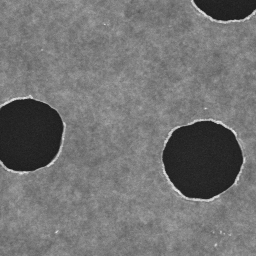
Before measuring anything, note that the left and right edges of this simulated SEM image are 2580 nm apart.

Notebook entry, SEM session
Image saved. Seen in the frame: holes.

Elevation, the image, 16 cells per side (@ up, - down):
@@@@@@@@@@@@----
@@@@@@@@@@@@@@@@
@@@@@@@@@@@@@@@@
@@@@@@@@@@@@@@@@
@@@@@@@@@@@@@@@@
@@@@@@@@@@@@@@@@
---@@@@@@@@@@@@@
----@@@@@@@@@@@@
----@@@@@@@----@
----@@@@@@-----@
@--@@@@@@@-----@
@@@@@@@@@@@---@@
@@@@@@@@@@@@@@@@
@@@@@@@@@@@@@@@@
@@@@@@@@@@@@@@@@
@@@@@@@@@@@@@@@@